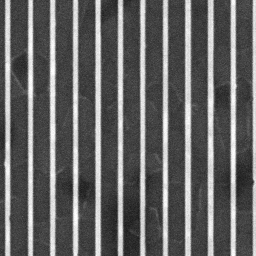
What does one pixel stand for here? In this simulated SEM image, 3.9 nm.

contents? parallel lines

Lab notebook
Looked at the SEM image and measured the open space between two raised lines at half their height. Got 72.7 nm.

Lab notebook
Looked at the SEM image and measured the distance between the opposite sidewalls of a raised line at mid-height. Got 16.6 nanometers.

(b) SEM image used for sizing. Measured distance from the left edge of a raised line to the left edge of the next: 87.8 nm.